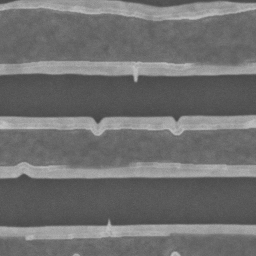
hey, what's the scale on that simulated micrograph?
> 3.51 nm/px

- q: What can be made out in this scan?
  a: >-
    one or a few lines or trenches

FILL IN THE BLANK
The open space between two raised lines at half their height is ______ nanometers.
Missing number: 186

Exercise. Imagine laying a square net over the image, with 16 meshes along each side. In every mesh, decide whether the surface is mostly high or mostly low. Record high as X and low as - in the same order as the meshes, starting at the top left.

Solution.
XXXXXXXX-----XXX
XXXXXXXXXXXXXXXX
XXXXXXXXXXXXXXXX
XXXXXXXXXXXXXXXX
----------------
----------------
----------------
----------------
XXXXXXXXXXXXXXXX
XXXXXXXXXXXXXXXX
XXXXXXXXXXXXXXXX
----------------
----------------
----------------
--XXXXXXXXXXXXXX
XXXXXXXXXXXXXXXX